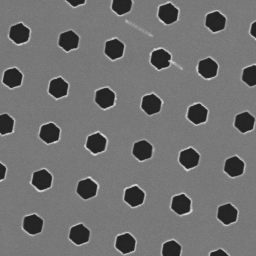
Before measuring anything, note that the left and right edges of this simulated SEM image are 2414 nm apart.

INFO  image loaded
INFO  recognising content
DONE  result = a regular array of holes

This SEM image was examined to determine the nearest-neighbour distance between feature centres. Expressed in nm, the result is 435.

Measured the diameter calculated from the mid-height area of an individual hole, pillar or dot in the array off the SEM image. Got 0.187 microns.